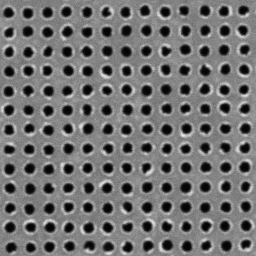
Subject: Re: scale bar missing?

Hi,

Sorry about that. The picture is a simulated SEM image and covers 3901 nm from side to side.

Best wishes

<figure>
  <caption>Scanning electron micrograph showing a regular array of holes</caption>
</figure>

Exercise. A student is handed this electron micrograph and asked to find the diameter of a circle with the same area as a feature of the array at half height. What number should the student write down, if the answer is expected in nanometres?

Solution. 172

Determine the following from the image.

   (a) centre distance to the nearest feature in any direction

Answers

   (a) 288 nm